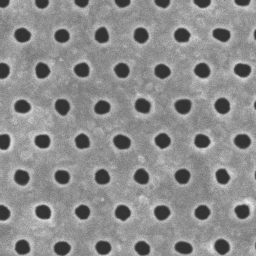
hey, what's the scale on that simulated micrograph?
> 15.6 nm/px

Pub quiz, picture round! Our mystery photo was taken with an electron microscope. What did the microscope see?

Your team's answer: a regular array of holes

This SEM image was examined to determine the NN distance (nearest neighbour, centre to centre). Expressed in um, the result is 0.616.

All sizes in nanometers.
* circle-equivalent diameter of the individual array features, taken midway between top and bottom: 236